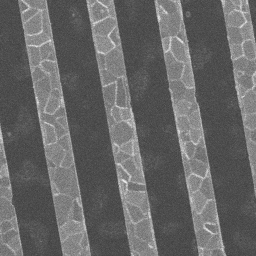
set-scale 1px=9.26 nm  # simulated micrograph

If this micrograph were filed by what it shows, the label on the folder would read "one or a few lines or trenches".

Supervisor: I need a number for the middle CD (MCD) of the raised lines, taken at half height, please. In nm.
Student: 236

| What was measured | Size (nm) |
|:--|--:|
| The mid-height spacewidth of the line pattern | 376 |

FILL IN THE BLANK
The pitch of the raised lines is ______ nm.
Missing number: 616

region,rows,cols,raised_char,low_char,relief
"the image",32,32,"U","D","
DDUUUUDDDDDUUUDDDDDUUUUDDDDDUUUD
DDDUUUDDDDDUUUDDDDDDUUUDDDDDUUUD
DDDUUUDDDDDUUUUDDDDDUUUDDDDDUUUD
DDDUUUDDDDDUUUUDDDDDUUUDDDDDUUUU
DDDUUUDDDDDDUUUDDDDDUUUDDDDDUUUU
DDDUUUUDDDDDUUUDDDDDUUUUDDDDDUDD
DDDUUUUDDDDDUUUDDDDDUUUUDDDDDUDD
DDDDUUUDDDDDUUUDDDDDDUUUDDDDDUUU
DDDDUUUDDDDDUUUUDDDDDUUUDDDDDUUU
DDDDUUUDDDDDDUUUDDDDDUUUDDDDDUUU
DDDDUUUUDDDDDUUUDDDDDUUUDDDDDUUU
DDDDUUUUDDDDDUUUDDDDDUUUDDDDDDUU
DDDDUUUUDDDDDUUUDDDDDUUUDDDDDDUU
DDDDDUUUDDDDDUUUDDDDDDUUUDDDDDUU
DDDDDUUUDDDDDUUUUDDDDDUUUDDDDDUU
DDDDDUUUDDDDDDUUUDDDDDUUUDDDDDUU
DDDDDUUUUDDDDDUUUDDDDDUUUDDDDDDU
DDDDDUUUUDDDDDUUUDDDDDUUUUDDDDDU
DDDDDDUUUDDDDDUUUDDDDDDDUUDDDDDU
UDDDDDUUUDDDDDUUUUDDDDDDUUDDDDDU
UDDDDDUUUDDDDDDUUUDDDDDUUUDDDDDU
UDDDDDUUUDDDDDDUUUDDDDDUUUDDDDDU
UDDDDDUUUUDDDDDUUUDDDDDUUUDDDDDD
UDDDDDUUUUDDDDDUUUDDDDDUUUUDDDDD
UDDDDDDUUUDDDDDUUUDDDDDDUUUDDDDD
UUDDDDDUUUDDDDDUUUUDDDDDUUUDDDDD
UUDDDDDUUUDDDDDUUUUDDDDDUUUDDDDD
UUDDDDDUUUUDDDDDUUUDDDDDUUUDDDDD
UUDDDDDUUUUDDDDDUUUDDDDDUUUDDDDD
UUDDDDDUUUUDDDDDUUUDDDDDUUUUDDDD
UUUDDDDDUUUDDDDDUUUDDDDDDUUUDDDD
UUUDDDDDUUUDDDDDUUUUDDDDDUUUDDDD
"